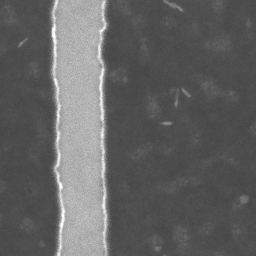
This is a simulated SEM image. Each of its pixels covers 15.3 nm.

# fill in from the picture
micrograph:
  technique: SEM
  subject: one or a few lines or trenches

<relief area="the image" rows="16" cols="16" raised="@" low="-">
@@@---@@@@@@@@@@
@@@---@@@@@@@@@@
@@@---@@@@@@@@@@
@@@---@@@@@@@@@@
@@@---@@@@@@@@@@
@@@@--@@@@@@@@@@
@@@@--@@@@@@@@@@
@@@@--@@@@@@@@@@
@@@@--@@@@@@@@@@
@@@@--@@@@@@@@@@
@@@@--@@@@@@@@@@
@@@@--@@@@@@@@@@
@@@@---@@@@@@@@@
@@@@---@@@@@@@@@
@@@@---@@@@@@@@@
@@@@---@@@@@@@@@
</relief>